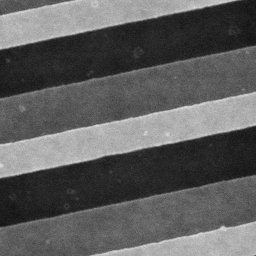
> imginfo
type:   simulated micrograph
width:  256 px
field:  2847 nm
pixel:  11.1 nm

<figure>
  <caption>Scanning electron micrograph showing lines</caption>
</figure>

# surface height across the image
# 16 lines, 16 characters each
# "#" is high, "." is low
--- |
############....
########........
###.............
.............###
........########
...#############
################
################
#############...
########........
###.............
.............###
.........#######
....############
################
################